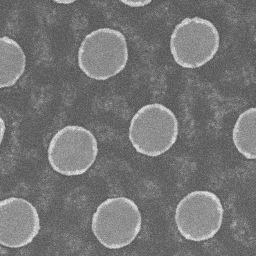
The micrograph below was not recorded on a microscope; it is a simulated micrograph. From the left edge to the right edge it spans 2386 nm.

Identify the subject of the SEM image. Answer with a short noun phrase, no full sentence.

raised bodies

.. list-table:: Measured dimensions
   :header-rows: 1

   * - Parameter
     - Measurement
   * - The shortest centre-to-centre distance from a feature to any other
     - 778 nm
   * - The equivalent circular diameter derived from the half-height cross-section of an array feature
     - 454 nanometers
